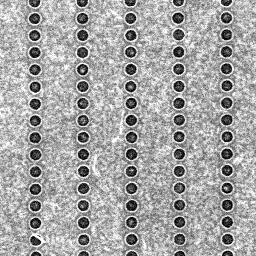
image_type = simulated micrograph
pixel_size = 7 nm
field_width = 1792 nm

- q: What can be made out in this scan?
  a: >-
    a regular array of holes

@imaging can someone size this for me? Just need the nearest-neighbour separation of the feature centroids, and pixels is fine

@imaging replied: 16.8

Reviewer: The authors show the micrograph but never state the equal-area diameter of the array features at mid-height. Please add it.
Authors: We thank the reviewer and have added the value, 0.0836 um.